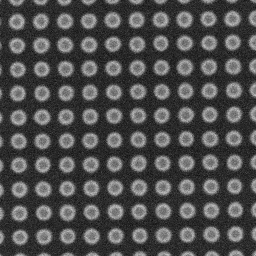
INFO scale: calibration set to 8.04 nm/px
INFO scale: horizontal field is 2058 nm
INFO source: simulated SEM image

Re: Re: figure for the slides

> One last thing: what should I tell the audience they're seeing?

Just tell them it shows an array of small figures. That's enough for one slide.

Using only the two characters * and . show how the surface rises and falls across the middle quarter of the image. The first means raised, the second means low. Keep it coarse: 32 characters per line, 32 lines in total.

**...***..****..****...***..****
**..****..****..****...***..****
**...***...***...***...**....**.
................................
................................
......*....**....***...**....***
**...***...***...***...***...***
**...***...***...***...***...***
**...***...***...***....**...**.
................................
................................
*.....**...***...***...***...***
**...***...***...***...***...***
**...***...***...***...***...***
**...***...***....**...**.....*.
................................
................................
*.....*.....**...***...***...***
**...***...***...***...***...***
***..***...***...***...***...***
**...***...***....**....*.....*.
................................
................................
**....**....**...***...***...***
**...****..***...****..***...***
**...****..***...***...****..***
**...***...***....**....**....*.
................................
................................
**....**....**...***...***...***
***..****..****..****..****..***
***..****..****..****..****..***